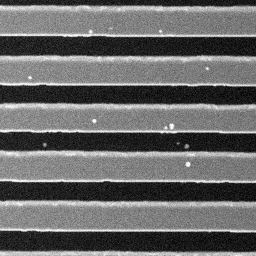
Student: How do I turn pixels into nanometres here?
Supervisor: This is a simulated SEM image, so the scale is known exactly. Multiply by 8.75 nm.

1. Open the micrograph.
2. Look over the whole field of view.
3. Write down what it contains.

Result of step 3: lines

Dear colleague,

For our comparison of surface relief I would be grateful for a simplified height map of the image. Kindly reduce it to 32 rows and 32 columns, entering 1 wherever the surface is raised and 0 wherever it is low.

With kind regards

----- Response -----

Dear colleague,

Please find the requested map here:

00000000000000000000000000000000
11111111111111111111111111111111
11111111111111111111111111111111
11111111111111111111111111111111
00000000111101111111111111111111
00000000000000000000000000000000
00000000000000000000000000000000
11111111111111111111111111111111
11111111111111111111111111111111
11111111111111111111111111111111
11111111111111111111111111111111
00000000000000000000000000000000
00000000000000000000000000000000
11111111111111111111111111111111
11111111111111111111111111111111
11111111111111111111111111111111
00000000000000000000111000011111
00000000000000000000000000000000
00000000000000000000000000000000
11111111111111111111111111111111
11111111111111111111111111111111
11111111111111111111111111111111
11111111111111111111111111111111
00000000000000000000000000000000
00000000000000000000000000000000
11111111111111111111100110111000
11111111111111111111111111111111
11111111111111111111111111111111
11111111111111111111111111111111
00000000000000000000000000000000
00000000000000000000000000000000
00000000000000000000000000000000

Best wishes